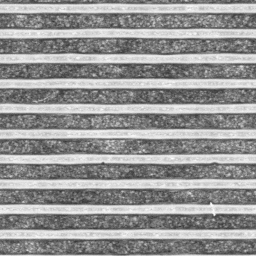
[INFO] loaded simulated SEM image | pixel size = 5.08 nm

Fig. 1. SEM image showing parallel lines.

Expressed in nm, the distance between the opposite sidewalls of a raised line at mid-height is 38.7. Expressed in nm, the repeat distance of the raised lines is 128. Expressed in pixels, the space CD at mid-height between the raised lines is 17.6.